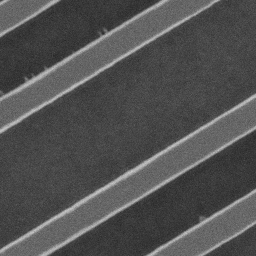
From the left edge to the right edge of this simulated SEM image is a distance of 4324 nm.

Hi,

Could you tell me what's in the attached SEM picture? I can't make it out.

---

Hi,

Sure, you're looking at lines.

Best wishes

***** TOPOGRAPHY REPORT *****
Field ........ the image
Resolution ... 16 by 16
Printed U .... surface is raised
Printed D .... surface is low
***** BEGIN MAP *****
UUUDDDDDDUUUUDDD
UDDDDDDDUUUDDDDD
DDDDDDUUUUDDDDDD
DDDDUUUUDDDDDDDD
DDDUUUDDDDDDDDDD
DUUUUDDDDDDDDDDD
UUUDDDDDDDDDDDDU
UDDDDDDDDDDDDUUU
DDDDDDDDDDDDUUUD
DDDDDDDDDDUUUUDD
DDDDDDDDUUUUDDDD
DDDDDDDUUUDDDDDD
DDDDDUUUUDDDDDDU
DDDUUUUDDDDDDUUU
DDUUUDDDDDDDUUUD
UUUUDDDDDDUUUDDD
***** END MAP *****